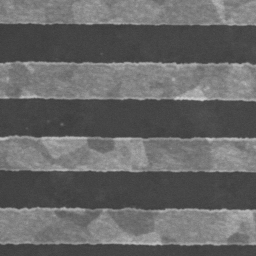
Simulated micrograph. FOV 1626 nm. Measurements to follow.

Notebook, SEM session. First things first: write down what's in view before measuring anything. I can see lines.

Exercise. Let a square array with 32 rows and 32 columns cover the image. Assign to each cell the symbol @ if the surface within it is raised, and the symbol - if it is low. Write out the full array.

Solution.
@@@@@@@@@@@@@@@@@@@@@@@@@@@@@@@@
@@@@@@@@@@@@@@@@@@@@@@@@@@@@@@@@
@@@@@@@@@@@@@@@@@@@@@@@@@@@@@@@@
--------------------------------
--------------------------------
--------------------------------
--------------------------------
--------------------------------
@@@@@@@@@@@@@@@@@@@@@@@@@@@@@@@@
@@@@@@@@@@@@@@@@@@@@@@@@@@@@@@@@
@@@@@@@@@@@@@@@@@@@@@@@@@@@@@@@@
@@@@@@@@@@@@@@@@@@@@@@@@@@@@@@@@
------------------------------@@
--------------------------------
--------------------------------
--------------------------------
--------------------------------
@@@@@@@@@@@@@@@@@@@@@@@@@@@@@@@@
@@@@@@@@@@@@@@@@@@@@@@@@@@@@@@@@
@@@@@@@@@@@@@@@@@@@@@@@@@@@@@@@@
@@@@@@@@@@@@@@@@@@@@@@@@@@@@@@@@
--------------------------------
--------------------------------
--------------------------------
--------------------------------
--------------------------------
@@@@@@@@@@@@@@@@@@@@@@@@@@@@@@@@
@@@@@@@@@@@@@@@@@@@@@@@@@@@@@@@@
@@@@@@@@@@@@@@@@@@@@@@@@@@@@@@@@
@@@@@@@@@@@@@@@@@@@@@@@@@@@@@@@@
@-@-@----@-@---@@@@@@@@@@@@@@@@@
--------------------------------